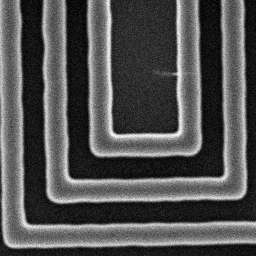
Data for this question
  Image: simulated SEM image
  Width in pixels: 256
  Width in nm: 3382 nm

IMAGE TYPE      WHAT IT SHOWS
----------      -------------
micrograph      groups of lines, slits or small figures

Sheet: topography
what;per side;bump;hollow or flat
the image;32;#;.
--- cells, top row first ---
##....##...###........###...##..
##....##...###........###...##..
###..###...###........###...##..
###..###...###........###...##..
##...###...###........###...##..
##....##...###........###...##..
##....##...###........###...##..
##....##...###........###...##..
###...##...###........###...##..
###...##...###........###...##..
###...##...###........###...###.
###...##...###........###...###.
###...##...###........###...###.
###...##...###........###...###.
###...##...###.........##...###.
###...##...###.........##...###.
###...##...###........###...###.
###...##...##############...###.
###...##...##############...###.
###...##....................###.
###...##....................###.
###...##....................###.
###...###...........###########.
###...#########################.
###...########################..
###.............................
###.............................
###.............................
################################
################################
.#####################..........
................................